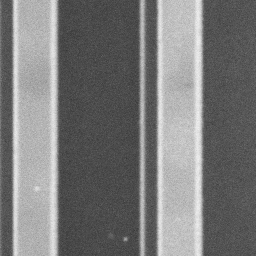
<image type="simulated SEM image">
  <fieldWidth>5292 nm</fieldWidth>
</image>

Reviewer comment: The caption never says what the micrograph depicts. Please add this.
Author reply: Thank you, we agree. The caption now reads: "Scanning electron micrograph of lines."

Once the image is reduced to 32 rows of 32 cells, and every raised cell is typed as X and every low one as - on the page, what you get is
--XXXXX-------------XXXXX-------
--XXXXX-------------XXXXX-------
--XXXXX-------------XXXXX-------
--XXXXX-------------XXXXX-------
--XXXXX-------------XXXXX-------
--XXXXX-------------XXXXX-------
--XXXXX-------------XXXXX-------
--XXXXX-------------XXXXX-------
--XXXXX-------------XXXXX-------
--XXXXX-------------XXXXX-------
--XXXXX-------------XXXXX-------
--XXXXX-------------XXXXX-------
--XXXXX-------------XXXXX-------
--XXXXX-------------XXXXX-------
--XXXXX-------------XXXXX-------
--XXXXX-------------XXXXX-------
--XXXXX-------------XXXXX-------
--XXXXX-------------XXXXX-------
--XXXXX-------------XXXXX-------
--XXXXX-------------XXXXX-------
--XXXXX-------------XXXXX-------
--XXXXX-------------XXXXX-------
--XXXXX-------------XXXXX-------
--XXXXX-------------XXXXX-------
--XXXXX-------------XXXXX-------
--XXXXX-------------XXXXX-------
--XXXXX-------------XXXXX-------
--XXXXX-------------XXXXX-------
--XXXXX-------------XXXXX-------
--XXXXX-------------XXXXX-------
--XXXXX-------------XXXXX-------
--XXXXX-------------XXXXX-------